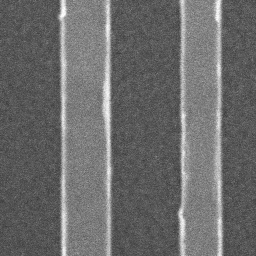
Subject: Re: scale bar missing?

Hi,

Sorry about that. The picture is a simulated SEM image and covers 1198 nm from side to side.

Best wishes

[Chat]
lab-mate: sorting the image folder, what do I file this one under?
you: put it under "one or a few lines or trenches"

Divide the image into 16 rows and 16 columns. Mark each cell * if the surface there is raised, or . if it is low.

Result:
....***....***..
....***....***..
....***....***..
....***....***..
....***....***..
....***....***..
....***....***..
....***....***..
....***....***..
....***....***..
....***....***..
....***....***..
....***....***..
....***....***..
....***....***..
....***....***..